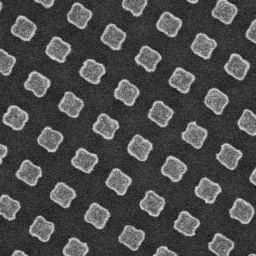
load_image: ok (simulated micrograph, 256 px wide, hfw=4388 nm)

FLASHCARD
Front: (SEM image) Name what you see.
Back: a regular array of raised bodies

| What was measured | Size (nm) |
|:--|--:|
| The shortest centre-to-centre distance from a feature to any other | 682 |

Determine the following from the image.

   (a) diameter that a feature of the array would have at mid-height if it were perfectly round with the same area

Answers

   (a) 376 nm